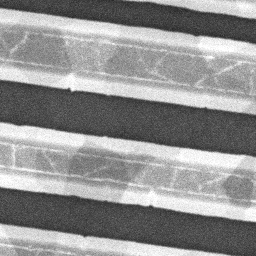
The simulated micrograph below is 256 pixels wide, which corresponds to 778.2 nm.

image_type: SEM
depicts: one or a few lines or trenches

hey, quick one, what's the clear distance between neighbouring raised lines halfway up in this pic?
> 0.164 microns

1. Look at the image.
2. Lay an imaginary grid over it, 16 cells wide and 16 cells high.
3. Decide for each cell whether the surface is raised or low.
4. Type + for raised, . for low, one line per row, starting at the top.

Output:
..............++
++++............
+++++++++++.....
++++++++++++++++
++++++++++++++++
.......+++++++++
..............++
................
+++.............
++++++++++......
++++++++++++++++
..++++++++++++++
..........++++++
................
+...............
++++++++........